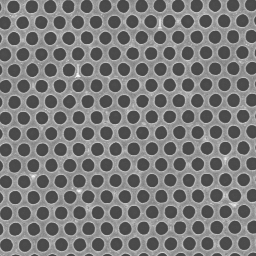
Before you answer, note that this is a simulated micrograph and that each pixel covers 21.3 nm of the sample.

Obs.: a regular array of holes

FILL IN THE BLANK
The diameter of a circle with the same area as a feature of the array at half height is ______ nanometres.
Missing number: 272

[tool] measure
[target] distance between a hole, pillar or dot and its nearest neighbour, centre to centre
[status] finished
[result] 382 nm